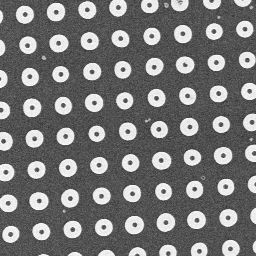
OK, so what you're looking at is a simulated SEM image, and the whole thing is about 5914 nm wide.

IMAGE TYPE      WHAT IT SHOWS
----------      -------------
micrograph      an array of small figures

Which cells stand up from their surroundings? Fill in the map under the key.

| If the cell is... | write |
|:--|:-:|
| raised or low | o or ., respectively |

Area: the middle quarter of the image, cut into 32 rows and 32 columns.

.....oooo....ooo.....oooo...oooo
o....oooo....oooo....ooo....oooo
o....oooo....ooo.....oo.........
o....ooo......o.................
................................
................................
......................oo.....ooo
..............oo.....oooo....ooo
o.....ooo....oooo....oooo....ooo
oo...ooooo...oooo....oooo.....oo
oo...ooooo....ooo......o........
oo....ooo.......................
................................
................................
.......................oo....ooo
........o.....oooo....oooo...ooo
oo....oooo....oooo....oooo...ooo
oo....oooo....oooo....oooo....oo
oo.....ooo....ooo...............
oo..............................
................................
...............................o
.......................ooo....oo
........oo.....ooo....ooooo...oo
ooo....oooo....oooo...ooooo...oo
ooo....oooo....oooo....ooo......
ooo....oooo....ooo..............
ooo.............................
................................
................................
................oo.....ooo.....o
.o......ooo....oooo....oooo....o